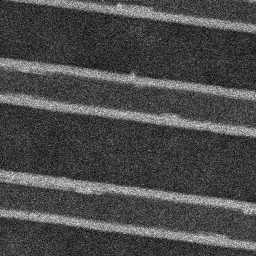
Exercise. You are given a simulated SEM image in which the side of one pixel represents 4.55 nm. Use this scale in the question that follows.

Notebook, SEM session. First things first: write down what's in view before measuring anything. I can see one or a few lines or trenches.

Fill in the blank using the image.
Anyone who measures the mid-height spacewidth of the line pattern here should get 325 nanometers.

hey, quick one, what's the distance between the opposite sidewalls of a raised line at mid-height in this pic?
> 183 nanometers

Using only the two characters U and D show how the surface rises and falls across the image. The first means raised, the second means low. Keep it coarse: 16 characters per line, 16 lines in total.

DDDDDUUUUUUUUUUU
DDDDDDDDDDDDDUUU
DDDDDDDDDDDDDDDD
DDDDDDDDDDDDDDDD
UUUUUDDDDDDDDDDD
UUUUUUUUUUUUUDDD
DDUUUUUUUUUUUUUU
DDDDDDDDDDUUUUUU
DDDDDDDDDDDDDDDD
DDDDDDDDDDDDDDDD
DDDDDDDDDDDDDDDD
UUUUUDDDDDDDDDDD
UUUUUUUUUUUUUDDD
DUUUUUUUUUUUUUUU
DDDDDDDDDUUUUUUU
DDDDDDDDDDDDDDDD